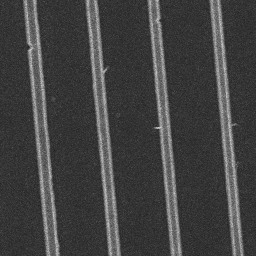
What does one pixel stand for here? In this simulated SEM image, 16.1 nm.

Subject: one or a few lines or trenches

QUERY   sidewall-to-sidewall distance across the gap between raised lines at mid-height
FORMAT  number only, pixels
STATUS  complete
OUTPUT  52.3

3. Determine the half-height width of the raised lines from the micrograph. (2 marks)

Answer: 142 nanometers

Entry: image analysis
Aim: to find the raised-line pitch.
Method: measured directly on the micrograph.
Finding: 991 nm